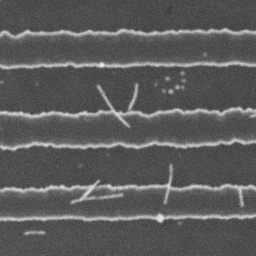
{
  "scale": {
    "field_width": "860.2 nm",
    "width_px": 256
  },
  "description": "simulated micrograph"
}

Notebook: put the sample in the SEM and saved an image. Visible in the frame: lines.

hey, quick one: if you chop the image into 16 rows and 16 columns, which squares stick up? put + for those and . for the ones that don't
................
................
++++++++++++++++
++++++++++++++++
................
................
................
++++++++++++++++
++++++++++++++++
................
................
................
++++++++++++++++
++++++++++++++++
................
................